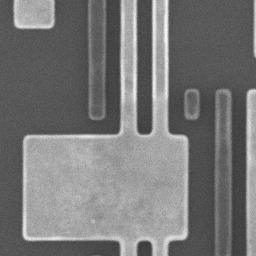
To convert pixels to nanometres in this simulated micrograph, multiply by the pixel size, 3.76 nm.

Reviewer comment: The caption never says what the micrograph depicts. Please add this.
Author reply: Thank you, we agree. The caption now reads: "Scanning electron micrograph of wiring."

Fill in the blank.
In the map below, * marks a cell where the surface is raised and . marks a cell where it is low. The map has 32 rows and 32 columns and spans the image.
..*****....**..**..**...........
..*****....**..**..**...........
..*****....**..**..**...........
...........**..**..**...........
...........**..**..**...........
...........**..**..**...........
...........**..**..**...........
...........**..**..**...........
...........**..**..**...........
...........**..**..**...........
...........**..**..**...........
...........**..**..**..**..**..*
...........**..**..**..**..**..*
...........**..**..**..**..**..*
...........**..**..**..**..**..*
...............**..**......**..*
...............**..**......**..*
...********************....**..*
...********************....**..*
...********************....**..*
...********************....**..*
...********************....**..*
...********************....**..*
...********************....**..*
...********************....**..*
...********************....**..*
...********************....**..*
...********************....**..*
...********************....**..*
...********************....**..*
...............**..**......**..*
...............**..**......**..*